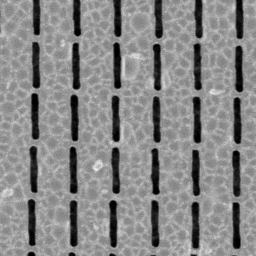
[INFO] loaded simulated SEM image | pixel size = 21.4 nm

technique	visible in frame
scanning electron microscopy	a regular array of holes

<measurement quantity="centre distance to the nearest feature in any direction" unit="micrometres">0.862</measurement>